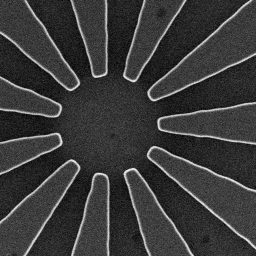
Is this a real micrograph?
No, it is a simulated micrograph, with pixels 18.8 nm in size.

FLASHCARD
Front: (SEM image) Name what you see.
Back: groups of lines, slits or small figures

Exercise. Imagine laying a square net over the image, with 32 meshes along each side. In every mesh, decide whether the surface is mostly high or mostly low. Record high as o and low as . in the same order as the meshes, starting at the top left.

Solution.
ooo......oooo.....ooooo........o
oooo.....oooo.....oooo........oo
ooooo.....ooo....ooooo.......ooo
oooooo....ooo....oooo......ooooo
.ooooo....ooo....ooo......oooooo
..ooooo....oo...oooo.....ooooooo
...oooo....oo...ooo.....oooooooo
....oooo...oo...ooo....oooooooo.
.....oooo..oo...oo....oooooo....
.......oo...o...o....ooooo......
oo......oo.........ooooo........
oooo...............ooo..........
oooooo.............o............
oooooooo....................oooo
......o...............oooooooooo
....................oooooooooooo
.....................ooooooooooo
..oooooo....................oooo
ooooooo............o............
ooooo..............ooo..........
ooo.....oo.........ooooo........
o......ooo......o....oooooo.....
......ooo...oo..oo....ooooooo...
.....oooo..ooo..ooo....oooooooo.
....oooo...ooo..ooo.....oooooooo
..ooooo....ooo...ooo.....ooooooo
.oooooo....ooo...ooo......oooooo
oooooo....oooo...oooo.......oooo
ooooo.....oooo...ooooo.......ooo
ooooo.....oooo....ooooo.......oo
oooo.....ooooo....ooooo........o
ooo......ooooo....oooooo........